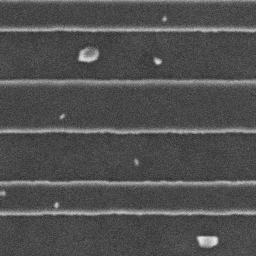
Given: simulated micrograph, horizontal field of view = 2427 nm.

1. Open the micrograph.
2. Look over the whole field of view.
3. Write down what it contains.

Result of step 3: lines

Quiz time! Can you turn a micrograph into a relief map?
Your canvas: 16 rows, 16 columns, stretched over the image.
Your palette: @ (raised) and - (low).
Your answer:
@@@@@@@@@@@@@@@@
@@@@@@@@@@@@@@@@
----------------
-----@----------
----------------
@@@@@@@@@@@@@@@@
@@@@@@@@@@@@@@@@
@@@@@@@@@@@@@@@@
----------------
----------------
----------------
@@@@@@@@@@@@@@@@
@@@@@@@@@@@@@@@@
----------------
----------------
----------------